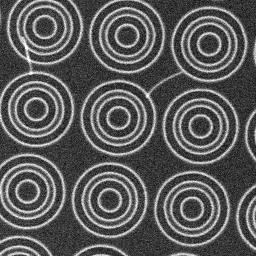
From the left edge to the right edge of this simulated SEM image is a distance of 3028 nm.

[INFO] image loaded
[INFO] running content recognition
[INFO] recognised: an array of small figures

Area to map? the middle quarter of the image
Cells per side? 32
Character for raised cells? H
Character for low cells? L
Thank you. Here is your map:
HHHHHHHHHHHLLLLLLLLLLHHHHHHHHLLL
HHHHHHHHHHHHHLLLLLHHHHHHHHHHHHLL
HHHHHHHHHHHHHHHHHHHHHHHHHHHHHHHL
HHHHHHHHHHHHHHHHHHHHHHHHHHHHHHHH
HHHHHHHHHHHHLLLHHHHHHHHHHHHHHHHH
HHHHHHHHHLLLLLLLLLHHHHHHHHHHHHHH
LHHHHHHHLLLLLLLLLLLHHHHHHHHHHHHH
LHHHHHHLLLHHHHHHHLLLHHHHHHHHHHLL
LLHHHHLLLHHHHLLHHHLLLHHHHHHHHLLL
LLHHHHLLHHHLLLLLLHHLLLHHHHHLLLLH
LLHHHLLHHHLLLLLLLLHHLLHHHHHLLLHH
LLHHHLLHHLLLHHHHLLHHLLHHHHLLLHHL
LLHHHLLHHLLHHHHHLLLHLLLHHHLLHHLL
LLHHHLLHLLLHHHHHLLLHLLLHHLLLHHLL
LHHHHLLHHLLHHHHHLLHHLLLHHLLLHLLH
LHHHHLLHHLLLHHHHLLHHLLHHHLLHHLLH
HHHHHLLHHHLLLLLLLLHHLLHHHLLHHLLH
HHHHHHLLHHHLLLLLLHHLLLHHHLLLHHLL
HHHHHHLLLHHHHLHHHHLLLHHHHHLLHHLL
HHHHHHHLLLHHHHHHHLLLHHHHHHLLLHHL
HHHHHHHHLLLLLLLLLLLHHHHHHHHLLHHH
HHHHHHHHHLLLLLLLLLHHHHHHHHHLLLLH
HHHHHHHHHHHHHLHHHHHHHHHHHHHHLLLL
HHHHHHHHHHHHHHHHHHHHHHHHHHHHHHLL
HHHHHHHHHHHHHHHHHHHHHHHHHHHHHHHH
HHHHHHHHLLLLLLLHHHHHHHHHHHHHHHHH
HHHHHHHLLLLLLLLLHHHHHHHHHHHHHHHH
HHHHHLLLLHHHHHLLLLHHHHHHHHHHHHLL
HHHHLLLHHHHHHHHHLLHHHHHHHHHLLLLL
HHHHLLHHHLLLLLHHHLLHHHHHHHLLLLHH
HHHLLLHHLLLLLLLHHLLLHHHHHLLLHHHH
HHHLLHHLLLHHHLLLHHLLHHHHLLLHHHLL